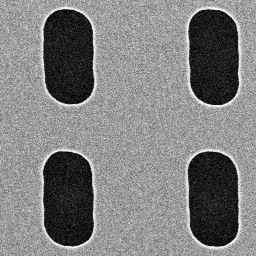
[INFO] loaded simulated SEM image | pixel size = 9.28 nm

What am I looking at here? holes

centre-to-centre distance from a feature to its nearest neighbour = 1320 nm